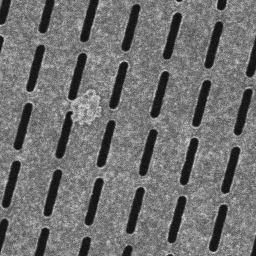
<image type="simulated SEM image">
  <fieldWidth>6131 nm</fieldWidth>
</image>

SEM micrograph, a regular array of holes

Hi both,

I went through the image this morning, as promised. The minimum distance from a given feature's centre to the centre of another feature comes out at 42.4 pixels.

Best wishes